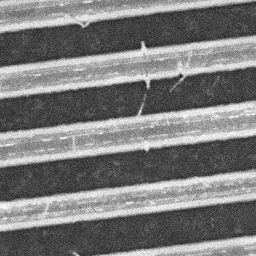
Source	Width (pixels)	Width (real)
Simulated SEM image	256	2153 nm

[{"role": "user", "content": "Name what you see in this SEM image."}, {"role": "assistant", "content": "one or a few lines or trenches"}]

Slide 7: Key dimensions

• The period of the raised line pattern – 66.3 px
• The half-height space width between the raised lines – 360 nanometers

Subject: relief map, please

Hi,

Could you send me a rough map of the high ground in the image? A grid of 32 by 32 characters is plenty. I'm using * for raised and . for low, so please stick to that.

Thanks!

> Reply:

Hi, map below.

*************************.......
****************................
**********......................
................................
................................
...........................*****
..................**************
...........*********************
...************************.....
*******************.............
***********.....................
***.............................
................................
.............................***
....................************
.............*******************
....****************************
************************........
***************.................
*******.........................
................................
................................
..........................******
..................**************
..........*********************.
..**********************........
****************................
********........................
................................
................................
............................****
....................************